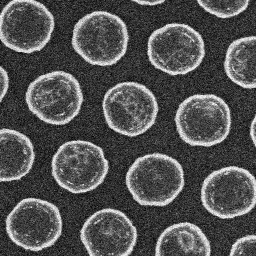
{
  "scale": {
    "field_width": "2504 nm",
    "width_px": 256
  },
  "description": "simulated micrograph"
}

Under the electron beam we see a regular array of raised bodies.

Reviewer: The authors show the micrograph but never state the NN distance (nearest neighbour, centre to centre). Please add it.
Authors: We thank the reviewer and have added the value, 731 nanometres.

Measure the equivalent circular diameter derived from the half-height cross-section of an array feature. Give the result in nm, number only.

498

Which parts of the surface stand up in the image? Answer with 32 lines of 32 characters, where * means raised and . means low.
.****....................******.
******.....................***..
******....*****.................
******....*****......***........
******...*******...******.......
.****....*******...******....***
..........*****....******....***
...........***.....******...****
....................****....****
*.....**.....................***
*...******.....*..............**
*...******....****..............
....******...******.....***.....
....******...******....*****....
.....****....******...*******...
..............*****...*******...
*..............***.....*****....
***....................****.....
****....****....................
****...******......*............
****...******....*****..........
***....******...*******....****.
.......******...*******...******
........****....*******..*******
.................*****...*******
..****....................******
..*****.....**.............****.
.******....*****................
.*******...******....***........
.******...*******...*****.......
..****.....******...******....**
...........*****....******...***